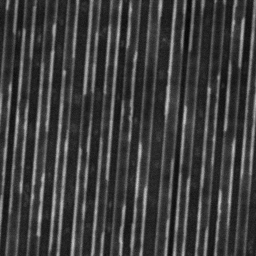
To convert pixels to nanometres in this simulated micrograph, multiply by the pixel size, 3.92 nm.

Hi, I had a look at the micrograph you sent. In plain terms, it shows parallel lines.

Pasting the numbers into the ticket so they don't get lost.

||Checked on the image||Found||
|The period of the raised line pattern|20.7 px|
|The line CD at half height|0.0449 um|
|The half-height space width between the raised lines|37.1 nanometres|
